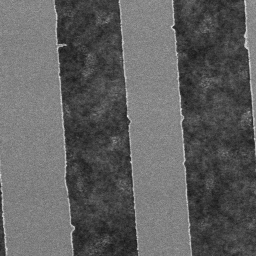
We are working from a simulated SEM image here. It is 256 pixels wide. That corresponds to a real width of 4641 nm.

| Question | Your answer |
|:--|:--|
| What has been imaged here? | one or a few lines or trenches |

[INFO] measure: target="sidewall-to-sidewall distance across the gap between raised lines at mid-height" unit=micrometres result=1.18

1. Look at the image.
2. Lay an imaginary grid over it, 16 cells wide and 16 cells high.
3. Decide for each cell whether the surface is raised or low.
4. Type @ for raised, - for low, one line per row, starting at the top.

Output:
@@@----@@@@----@
@@@@----@@@----@
@@@@----@@@----@
@@@@----@@@-----
@@@@----@@@-----
@@@@----@@@-----
@@@@----@@@-----
@@@@----@@@-----
@@@@----@@@-----
@@@@----@@@@----
@@@@----@@@@----
@@@@----@@@@----
@@@@----@@@@----
@@@@----@@@@----
@@@@@----@@@----
@@@@@----@@@----